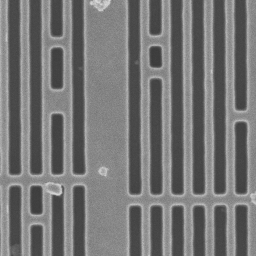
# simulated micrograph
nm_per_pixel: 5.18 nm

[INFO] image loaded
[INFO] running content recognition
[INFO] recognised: groups of lines, slits or small figures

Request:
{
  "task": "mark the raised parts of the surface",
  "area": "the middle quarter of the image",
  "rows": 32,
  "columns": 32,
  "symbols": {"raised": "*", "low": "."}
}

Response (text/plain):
**...***********...***..***...**
**...***********...********...**
**...***********...********...**
**...***********...********...**
**...***********...***..***...**
**...***********...***...**...**
**...***********...***...**...**
**...***********...***...**...**
**...***********...***..***...**
**...***********...***..***...**
**...***********...***..***...**
**...***********...**....**...**
**...***********...**....**...**
**...***********...**....**...**
**...***********...***...**...**
**...***********...***...**...**
**...***********...***...**...**
**...***********...***...**...**
**...***********...***...**...**
**...***********...***...**...**
**...***********...***...**...**
**...***********...***...**...**
**...***********...***...**...**
**...***********...***...**...**
**...***********...***...**...**
**...***********...***...**...**
**...***********...***...**...**
***..***********...***...**...**
****************...***...**...**
****************...***...**...**
****************...***...**...**
**...***********...***...**...**